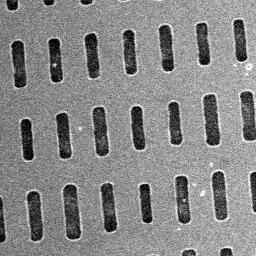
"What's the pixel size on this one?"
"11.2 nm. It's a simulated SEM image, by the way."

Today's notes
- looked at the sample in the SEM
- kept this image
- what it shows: a regular array of holes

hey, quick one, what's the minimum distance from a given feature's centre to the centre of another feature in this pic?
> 416 nm